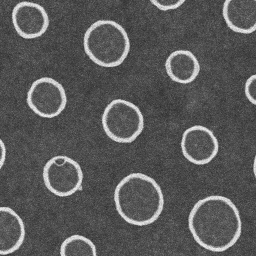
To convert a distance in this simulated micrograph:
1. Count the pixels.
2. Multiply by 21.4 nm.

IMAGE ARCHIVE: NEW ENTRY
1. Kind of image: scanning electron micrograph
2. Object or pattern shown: a regular array of raised bodies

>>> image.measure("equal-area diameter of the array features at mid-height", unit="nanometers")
768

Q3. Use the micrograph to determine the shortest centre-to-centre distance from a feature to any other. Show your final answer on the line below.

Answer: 1700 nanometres